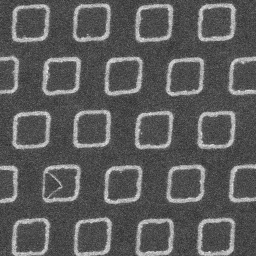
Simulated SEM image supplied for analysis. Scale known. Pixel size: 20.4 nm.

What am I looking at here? a regular array of raised bodies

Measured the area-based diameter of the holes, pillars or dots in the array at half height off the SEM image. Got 763 nm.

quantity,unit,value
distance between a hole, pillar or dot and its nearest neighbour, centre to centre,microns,1.24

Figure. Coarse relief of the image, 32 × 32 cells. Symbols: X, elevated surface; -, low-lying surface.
--------------------------------
--XXXX----XXXX---XXXX----XXXX---
--XXXX----XXXX---XXXX----XXXX---
--XXXX---XXXXX---XXXX----XXXX---
--XXXX---XXXX----XXXX----XXXX---
--------------------------------
--------------------------------
XX-----XXX----XXX------XX-----XX
XX----XXXX---XXXXX---XXXX----XXX
XX----XXXX---XXXX----XXXX----XXX
XX----XXXX---XXXX----XXXX----XXX
------XX------XX-----XXX-----XXX
--------------------------------
--------------------------------
--XXXX----XXXX----XXX----XXXX---
--XXXX----XXXX---XXXX----XXXX---
--XXXX---XXXXX---XXXX----XXXX---
--XXXX---XXXX----XXXX----XXXX---
--------------------------------
--------------------------------
--------------------------------
XX----XXXX----XXX----XXXX----XXX
XX-----XXX---XXXX----XXXX----XXX
XX-----XXX---XXXX----XXXX----XXX
XX----XXX----XXXX----XXXX----XXX
--------------------------------
--------------------------------
------------X-------------------
--XXXX----XXXX---XXXX----XXXX---
--XXXX----XXXX---XXXX----XXXX---
--XXXX----XXXX---XXXX----XXXX---
--XXX-----XXX----XXXX----XXXX---